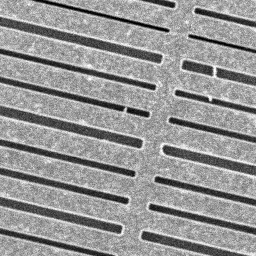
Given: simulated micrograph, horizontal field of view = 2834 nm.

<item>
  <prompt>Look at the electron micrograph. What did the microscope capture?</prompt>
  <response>parallel lines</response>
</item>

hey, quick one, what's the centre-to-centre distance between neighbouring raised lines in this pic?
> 324 nanometers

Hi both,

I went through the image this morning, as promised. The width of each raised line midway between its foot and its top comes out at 0.236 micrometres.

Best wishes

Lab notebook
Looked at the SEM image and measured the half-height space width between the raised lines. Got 84.9 nanometres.